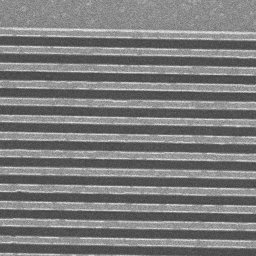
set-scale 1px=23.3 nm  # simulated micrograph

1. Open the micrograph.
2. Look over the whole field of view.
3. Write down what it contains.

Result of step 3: parallel lines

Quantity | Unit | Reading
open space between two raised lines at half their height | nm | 218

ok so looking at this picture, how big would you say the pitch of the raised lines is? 403 nm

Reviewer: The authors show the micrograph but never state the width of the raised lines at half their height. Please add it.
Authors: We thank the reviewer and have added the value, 198 nanometres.